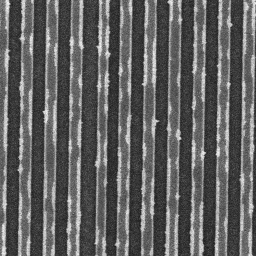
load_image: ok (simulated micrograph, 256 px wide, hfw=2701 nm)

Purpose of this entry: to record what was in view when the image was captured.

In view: parallel lines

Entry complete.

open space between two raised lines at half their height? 148 nanometres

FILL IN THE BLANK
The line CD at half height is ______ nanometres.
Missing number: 112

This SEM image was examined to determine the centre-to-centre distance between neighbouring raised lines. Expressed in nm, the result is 260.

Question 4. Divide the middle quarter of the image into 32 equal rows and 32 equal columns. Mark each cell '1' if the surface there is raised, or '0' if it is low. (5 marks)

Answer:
00110000011000111000111000111000
00110000011000111000111000111000
00110000011000110000111000111000
00110000011000110000111000111000
00110000011000111000111000111000
00111000111000111000111000111000
00110000011000111000111000111000
01110000011000111000111000111000
01110000011000110000111000111000
01110000011000110000111000111000
01110000011000110000111000111000
01110000011000110000111000111000
01110000011000111000110000111000
01110000011000111000111000111000
00110000011000111000111000111000
00110000011000111000111000111000
00110000011000110000111000111000
00110000111000110000111000111000
00110000011000110000110000111000
01110000011000110000110000111000
01110000011000110000110000111000
01110000010000110000110000111000
01110000010000110000110000111000
01110000111000110000110000110000
01110000111000110000110000110000
01110000111000110000110000110000
01110000110000110000110000110000
01110000110001110000110000110000
01110000110001110000110000110000
01110000111001110000110000110000
01110000111001110000110000110000
01110000110001110001110000110000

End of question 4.